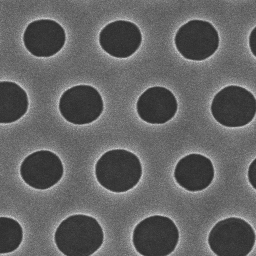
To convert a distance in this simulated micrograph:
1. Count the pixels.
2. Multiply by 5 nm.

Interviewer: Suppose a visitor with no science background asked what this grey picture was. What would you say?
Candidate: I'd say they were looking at a regular array of holes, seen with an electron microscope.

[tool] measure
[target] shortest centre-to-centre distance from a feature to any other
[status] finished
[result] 75.6 px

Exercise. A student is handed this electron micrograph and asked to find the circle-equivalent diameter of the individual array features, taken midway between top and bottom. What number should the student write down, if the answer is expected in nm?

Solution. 201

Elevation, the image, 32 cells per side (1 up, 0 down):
11111111111111111111111111111111
11111111111111111111111111111111
11111011111111111111111101111111
11100000111110000111110000011111
11100000111100000011110000011110
11100000111110000011110000011110
11110001111110000111110000011111
11111111111111111111111101111111
11111111111111111111111111111111
11111111111111111111111111111111
00111111111111111111111111111111
00011111000011111100011111100001
00011111000001111000001111100000
00011110000001111000001111000000
00011111000011111100001111100000
11111111111111111111111111110001
11111111111111111111111111111111
11111111111111111111111111111111
11111111111111111111111111111111
11110001111110000111111001111111
11100000111100000011110000011110
11100000111100000011110000011110
11100001111100000111110000111110
11110011111110000111111000111111
11111111111111111111111111111111
11111111111111111111111111111111
11111111111111111111111111111111
00111111000011111100011111110011
00011110000001111000001111100000
00011110000001111000001111000000
00111110000001111000001111000000
01111111000011111000011111100001